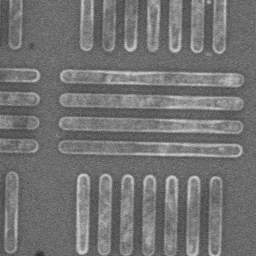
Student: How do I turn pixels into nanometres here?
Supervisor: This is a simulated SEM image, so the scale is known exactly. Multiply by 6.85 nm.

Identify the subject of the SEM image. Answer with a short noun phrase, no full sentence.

groups of lines, slits or small figures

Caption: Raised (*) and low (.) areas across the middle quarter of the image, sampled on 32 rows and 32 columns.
................................
................................
********************************
********************************
.*******************************
................................
................................
................................
*****************************...
********************************
.....***************************
................................
................................
****............................
******************************..
********************************
.........***********************
................................
................................
********........................
********************************
********************************
.............***.....***********
................................
................................
................................
................................
................................
....**...***...**....*....*.....
....**...***...**...***...**....
....**...***...**...***...**...*
....**...***...**...***...**...*